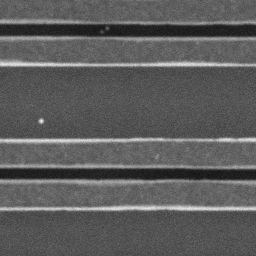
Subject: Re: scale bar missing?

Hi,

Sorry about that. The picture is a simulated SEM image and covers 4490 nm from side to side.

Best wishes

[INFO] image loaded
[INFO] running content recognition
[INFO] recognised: lines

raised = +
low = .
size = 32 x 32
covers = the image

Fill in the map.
++++++++++++++++++++++++++++++++
++++++++++++++++++++++++++++++++
++++++++++++++++++++++++++++++++
................................
................................
++++++++++++++++++++++++++++++++
++++++++++++++++++++++++++++++++
++++++++++++++++++++++++++++++++
................................
................................
................................
................................
................................
................................
................................
................................
................................
++++++++++++++++++++++++++++++++
++++++++++++++++++++++++++++++++
++++++++++++++++++++++++++++++++
++++++++++++++++++++++++++++++++
................................
................................
++++++++++++++++++++++++++++++++
++++++++++++++++++++++++++++++++
++++++++++++++++++++++++++++++++
................................
................................
................................
................................
................................
................................